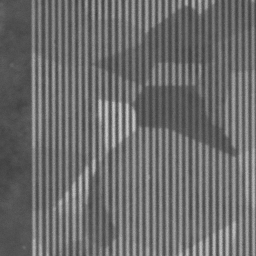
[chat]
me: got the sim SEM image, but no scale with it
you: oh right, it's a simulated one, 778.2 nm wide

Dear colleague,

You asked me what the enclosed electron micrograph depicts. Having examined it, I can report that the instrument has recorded parallel lines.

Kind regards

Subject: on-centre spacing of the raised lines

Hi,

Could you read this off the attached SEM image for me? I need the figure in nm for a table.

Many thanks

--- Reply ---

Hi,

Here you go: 20.2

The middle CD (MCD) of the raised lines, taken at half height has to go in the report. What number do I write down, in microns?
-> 0.0087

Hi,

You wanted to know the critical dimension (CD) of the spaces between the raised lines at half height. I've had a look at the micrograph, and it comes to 12.9 nm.